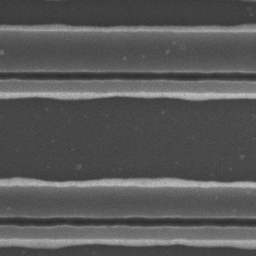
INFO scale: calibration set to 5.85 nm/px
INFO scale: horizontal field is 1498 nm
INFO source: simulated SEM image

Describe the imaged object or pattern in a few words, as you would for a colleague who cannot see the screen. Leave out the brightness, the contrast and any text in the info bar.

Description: lines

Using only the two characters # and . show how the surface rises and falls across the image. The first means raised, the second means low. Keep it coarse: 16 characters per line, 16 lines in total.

................
................
################
################
################
################
................
................
................
................
................
###...######....
################
################
################
................